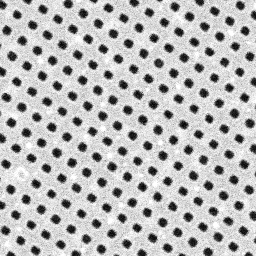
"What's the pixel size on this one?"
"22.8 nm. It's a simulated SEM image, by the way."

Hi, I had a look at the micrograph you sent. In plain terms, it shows a regular array of holes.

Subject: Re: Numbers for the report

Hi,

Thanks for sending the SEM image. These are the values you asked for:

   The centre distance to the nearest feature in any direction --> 411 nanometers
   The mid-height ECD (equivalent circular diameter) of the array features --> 245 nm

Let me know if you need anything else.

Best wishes